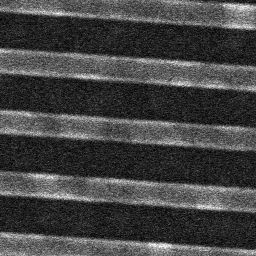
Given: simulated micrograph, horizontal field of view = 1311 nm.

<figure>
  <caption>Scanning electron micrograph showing one or a few lines or trenches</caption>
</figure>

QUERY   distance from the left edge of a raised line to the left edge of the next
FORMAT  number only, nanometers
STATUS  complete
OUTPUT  311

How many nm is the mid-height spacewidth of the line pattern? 202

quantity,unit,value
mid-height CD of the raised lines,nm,112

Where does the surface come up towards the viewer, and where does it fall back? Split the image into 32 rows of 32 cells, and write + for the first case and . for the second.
++++++++.++++++++++++++++++.....
....++++.+++++++++++++++++++++++
................++++++++++++++++
................................
................................
................................
+++++...........................
+++++++++++++++++++.............
++++++++++++++++++++++++++++++++
......+.++++++++++++++++++++++++
......................++++++++++
................................
................................
................................
++++.+++........................
++++++++++++++++++++++..........
++++++++++++++++++++++++++++++++
..............++++++++++++++++++
............................++++
................................
................................
................................
++++++++++++++..................
++++++++++++++++++++++++++++....
....++++++++++++++++++++++++++++
..................++++++++++++++
................................
................................
................................
++++.+..........................
++++++++++++++++++..............
++++++++++++++++++++++++++++++++